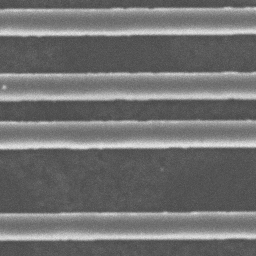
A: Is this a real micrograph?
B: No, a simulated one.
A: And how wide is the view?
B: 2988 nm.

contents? lines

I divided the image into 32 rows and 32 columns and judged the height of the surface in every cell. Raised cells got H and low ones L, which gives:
LLLLLLLLLLLLLLLLLLLLLLLLLLLLLLLL
HHHHHHHHHHHHHHHHHHHHHHHHHHHHHHHH
HHHHHHHHHHHHHHHHHHHHHHHHHHHHHHHH
HHHHHHHHHHHHHHHHHHHHHHHHHHHHHHHH
LLLLLLLLLLLLLLLLLLLLLLLLLLLLLLLL
LLLLLLLLLLLLLLLLLLLLLLLLLLLLLLLL
LLLLLLLLLLLLLLLLLLLLLLLLLLLLLLLL
LLLLLLLLLLLLLLLLLLLLLLLLLLLLLLLL
LLLLLLLLLLLLLLLLLLLLLLLLLLLLLLLL
HHHHHHHHHHHHHHHHHHHHHHHHHHHHHHHH
HHHHHHHHHHHHHHHHHHHHHHHHHHHHHHHH
HHHHHHHHHHHHHHHHHHHHHHHHHHHHHHHH
LLLLLLLLLLLLLLLLLLLLLLLLLLLLLLLL
LLLLLLLLLLLLLLLLLLLLLLLLLLLLLLLL
LLLLLLLLLLLLLLLLLLLLLLLLLLLLLLLL
HHHHHHHHHHHHHHHHHHHHHHHHHHHHHHHH
HHHHHHHHHHHHHHHHHHHHHHHHHHHHHHHH
HHHHHHHHHHHHHHHHHHHHHHHHHHHHHHHH
LLLLLLLLLLLLLLLLLLLLLLLLLLLLLLLL
LLLLLLLLLLLLLLLLLLLLLLLLLLLLLLLL
LLLLLLLLLLLLLLLLLLLLLLLLLLLLLLLL
LLLLLLLLLLLLLLLLLLLLLLLLLLLLLLLL
LLLLLLLLLLLLLLLLLLLLLLLLLLLLLLLL
LLLLLLLLLLLLLLLLLLLLLLLLLLLLLLLL
LLLLLLLLLLLLLLLLLLLLLLLLLLLLLLLL
LLLLLLLLLLLLLLLLLLLLLLLLLLLLLLLL
LLLLLLLLLLLLLLLLLLLLLLLLLLLLLLLL
HHHHHHHHHHHHHHHHHHHHHHHHHHHHHHHH
HHHHHHHHHHHHHHHHHHHHHHHHHHHHHHHH
HHHHHHHHHHHHHHHHHHHHHHHHHHHHHHHH
LLLLLLLLLLLLLLLLLLLLLLLLLLLLLLLL
LLLLLLLLLLLLLLLLLLLLLLLLLLLLLLLL